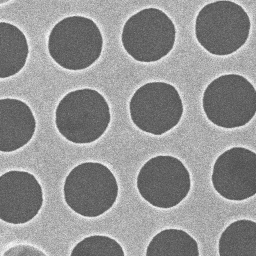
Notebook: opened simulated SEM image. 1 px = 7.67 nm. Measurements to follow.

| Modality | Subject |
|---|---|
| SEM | holes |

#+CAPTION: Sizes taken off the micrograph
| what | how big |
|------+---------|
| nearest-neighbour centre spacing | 564 nm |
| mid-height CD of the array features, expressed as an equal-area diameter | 416 nm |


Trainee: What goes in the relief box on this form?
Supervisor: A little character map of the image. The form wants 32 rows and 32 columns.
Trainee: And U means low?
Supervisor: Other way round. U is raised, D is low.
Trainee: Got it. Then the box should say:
UUUUUUUUUUUUUUUUUUUUUUUUUUDDDDUU
UUUUUUUUUUUUUUUUUDDDUUUUUDDDDDDU
UUUUUUUUDDDUUUUUDDDDDUUUDDDDDDDU
DDUUUUUDDDDDUUUDDDDDDDUUDDDDDDDU
DDDUUUDDDDDDDUUDDDDDDDUUDDDDDDDU
DDDUUUDDDDDDDUUDDDDDDDUUUDDDDDUU
DDDDUUDDDDDDDUUUDDDDDUUUUUDDDUUU
DDDUUUUDDDDDUUUUUDDDUUUUUUUUUUUU
DDDUUUUUDDDUUUUUUUUUUUUUUUUUUUUU
DUUUUUUUUUUUUUUUUUUUUUUUUUUUDDUU
UUUUUUUUUUUUUUUUUUDDDUUUUUDDDDDU
UUUUUUUUUDDDUUUUUDDDDDUUUUDDDDDD
DDUUUUUUDDDDDUUUDDDDDDDUUDDDDDDD
DDDDUUUDDDDDDDUUDDDDDDDUUDDDDDDD
DDDDUUUDDDDDDDUUDDDDDDDUUUDDDDDD
DDDDUUUDDDDDDDUUUDDDDDUUUUUDDDDU
DDDDUUUDDDDDDUUUUUDDDUUUUUUUUUUU
DDDDUUUUUDDDUUUUUUUUUUUUUUUUUUUU
DDDUUUUUUUUUUUUUUUUUUUUUUUUUUDDU
UUUUUUUUUUUUUUUUUUUUDUUUUUUDDDDD
UUUUUUUUUUDDDUUUUUDDDDDUUUUDDDDD
UDDUUUUUUDDDDDUUUDDDDDDDUUUDDDDD
DDDDDUUUDDDDDDDUUDDDDDDDUUDDDDDD
DDDDDUUUDDDDDDDUUDDDDDDDUUUDDDDD
DDDDDUUUDDDDDDDUUUDDDDDUUUUUDDDD
DDDDDUUUDDDDDDUUUUUDDDUUUUUUUUUU
DDDDDUUUUDDDDUUUUUUUUUUUUUUUUUUU
DDDDUUUUUUUUUUUUUUUUUUUUUUUUUUDU
UUUUUUUUUUUUUUUUUUUUUUUUUUUUDDDD
UUUUUUUUUUUUDUUUUUUDDDDDUUUUDDDD
UUUUUUUUUUDDDDDUUUUDDDDDDUUDDDDD
UUDDDUUUUDDDDDDUUUDDDDDDDUUDDDDD